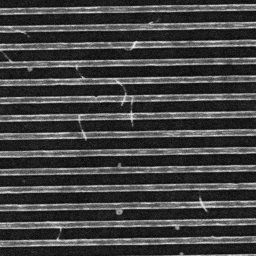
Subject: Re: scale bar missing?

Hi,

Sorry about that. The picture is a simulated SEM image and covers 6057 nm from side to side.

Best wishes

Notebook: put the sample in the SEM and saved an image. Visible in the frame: parallel lines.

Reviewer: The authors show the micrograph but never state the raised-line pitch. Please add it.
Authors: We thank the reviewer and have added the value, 422 nm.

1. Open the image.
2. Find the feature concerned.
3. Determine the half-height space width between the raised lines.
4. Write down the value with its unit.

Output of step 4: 281 nm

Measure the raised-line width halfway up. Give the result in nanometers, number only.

148